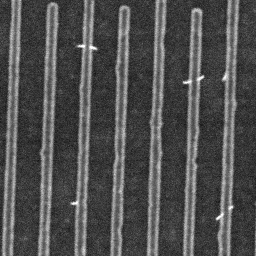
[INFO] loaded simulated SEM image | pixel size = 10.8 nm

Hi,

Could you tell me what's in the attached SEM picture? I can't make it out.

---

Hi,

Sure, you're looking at parallel lines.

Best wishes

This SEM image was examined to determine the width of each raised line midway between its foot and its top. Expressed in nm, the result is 84.6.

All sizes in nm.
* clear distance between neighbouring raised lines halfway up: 303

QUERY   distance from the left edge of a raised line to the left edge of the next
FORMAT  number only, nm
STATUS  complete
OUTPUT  389